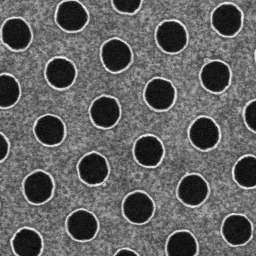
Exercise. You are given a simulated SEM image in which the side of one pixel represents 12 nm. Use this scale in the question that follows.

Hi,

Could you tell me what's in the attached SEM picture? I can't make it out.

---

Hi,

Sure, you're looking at a regular array of raised bodies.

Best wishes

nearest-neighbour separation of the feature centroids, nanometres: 694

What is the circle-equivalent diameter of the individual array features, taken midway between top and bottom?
0.391 microns